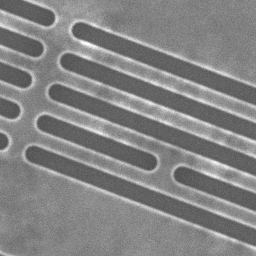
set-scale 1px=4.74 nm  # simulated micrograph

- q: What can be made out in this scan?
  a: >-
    groups of lines, slits or small figures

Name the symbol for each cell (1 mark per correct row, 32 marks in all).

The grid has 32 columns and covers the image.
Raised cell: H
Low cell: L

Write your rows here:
LLLLHHHHHHHHHHHHHHHHHHHHHHHHHHHH
HLLLLLLHHHHHHHHHHHHHHHHHHHHHHHHH
HHHLLLLHHHHHHHHHHHHHHHHHHHHHHHHH
LHHHHHHHHLLLLHHHHHHHHHHHHHHHHHHH
LLLHHHHHHLLLLLLHHHHHHHHHHHHHHHHH
LLLLLHHHHHHLLLLLLLHHHHHHHHHHHHHH
HHLLLHHHHHHHHHLLLLLLHHHHHHHHHHHH
HHHHHHHHLLLHHHHHLLLLLLLHHHHHHHHH
LLHHHHHHLLLLLLHHHHHLLLLLLLHHHHHH
LLLLHHHHHHLLLLLLLHHHHHLLLLLLHHHH
HLLLHHHLHHHHHLLLLLLHHHHHHLLLLLLH
HHHHHHLLLLHHHHHHLLLLLLHHHHHLLLLL
LHHHHHHLLLLLLHHHHHLLLLLLLHHHHHLL
LLHHHHHHHLLLLLLHHHHHHLLLLLLHHHHH
LLHHHLHHHHHHLLLLLLHHHHHLLLLLLLHH
HHHHHLLLLHHHHHLLLLLLLHHHHHLLLLLL
HHHHHLLLLLLLHHHHHLLLLLLLHHHHHLLL
LHHHHHHHLLLLLLLHHHHHLLLLLLHHHHHL
LHHLLHHHHHHLLLLLLHHHHHLLLLLLLHHH
HHHLLLLLHHHHHLLLLLLHHHHHHLLLLLLH
HHHHLLLLLLLHHHHHLLLLHHHHHHHHLLLL
HHHHHHHLLLLLLHHHHHHHHHLLLHHHHHLL
HHHHHHHHHHLLLLLLHHHHHHLLLLLLHHHH
HHHHHHHHHHHHLLLLLLLHHHHHLLLLLLHH
HHHHHHHHHHHHHHHLLLLLLHHHHHHLLLLL
HHHHHHHHHHHHHHHHHLLLLLLLHHHHHLLL
HHHHHHHHHHHHHHHHHHHHLLLLLLLHHHHH
HHHHHHHHHHHHHHHHHHHHHHHLLLLLLHHH
HHHHHHHHHHHHHHHHHHHHHHHHHHLLLLLL
HHHHHHHHHHHHHHHHHHHHHHHHHHHHLLLL
HHHHHHHHHHHHHHHHHHHHHHHHHHHHHHHL
HHHHHHHHHHHHHHHHHHHHHHHHHHHHHHHH